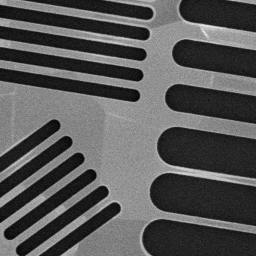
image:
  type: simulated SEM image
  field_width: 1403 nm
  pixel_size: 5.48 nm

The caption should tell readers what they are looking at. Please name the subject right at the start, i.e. groups of lines, slits or small figures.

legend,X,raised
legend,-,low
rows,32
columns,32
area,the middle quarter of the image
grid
---------------XXXXXXXXXXXXXX---
-------------------XXXXXXXXXXXXX
XXXXXX--------------XXXXXXXXXXXX
-XXXXXXXXXX---------XXXXXXXXXXXX
------XXXXXXXXXXXXXXXXXXXXXXXXXX
-------------XXXXXXXXXXXXXX-----
------------------XXXXXXXX------
XXXX---------------XXXXXX-------
XXXXXXXXXXX--------XXXXXX-------
XXXXXXXXXXXXXXXX--XXXXXXX-------
XXXXXXXXXXXXXXXXXXXXXXXXXX------
XXXXXXXXXXXXXXXXXXXXXXXXXXX-----
XXXXXXXXXXXXXXXXXXXXXXXXXXXXXXXX
XXXXXXXXXXXXXXXXXXXXXXXXXXXXXXXX
XXXXXXXXXXXXXXXXXXXXXXXXXXXXXXXX
XXXXXXXXXXXXXXXXXXXXXXXXXXXXXXXX
XXXXXXXXXXXXXXXXXXXXXXXXX-------
XXXXXXXXXXXXXXXXXXXXXXXX--------
--XXXXXXXXXXXXXXXXXXXXXX--------
--XXXXXXXXXXXXXXXXXXXXX---------
--XXXXXXXXXXXXXXXXXXXXX---------
-XXXXXXXXXXXXXXXXXXXXXX---------
XX---XXXXXXXXXXXXXXXXXX---------
X----XXXXXXXXXXXXXXXXXXX--------
-----XXXXXXXXXXXXXXXXXXXX-------
----XXXXXXXXXXXXXXXXXXXXXXX-----
--XXX---XXXXXXXXXXXXXXXXXXXXXXXX
-XXX----XXXXXXXXXXXXXXXXX-----XX
XXX-----XXXXXXXXXXXXXXX---------
XX-----XXXXXXXXXXXXXXX----------
------XXX-XXXXXXXXXXXX----------
----XXX----XXXXXXXXXX-----------